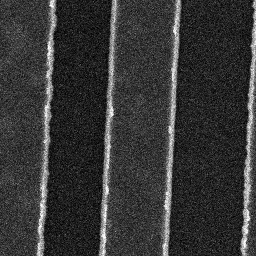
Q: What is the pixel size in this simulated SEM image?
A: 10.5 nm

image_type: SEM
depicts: one or a few lines or trenches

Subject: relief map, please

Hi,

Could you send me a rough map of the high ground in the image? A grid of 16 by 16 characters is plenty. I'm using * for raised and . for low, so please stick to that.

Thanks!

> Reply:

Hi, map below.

***....****.....
***....****.....
***....****.....
***....****.....
***....****.....
***....****.....
***....****.....
***....****.....
***....****.....
***....****....*
***....****....*
***....****....*
***....****....*
***...*****....*
***...****.....*
***...****.....*